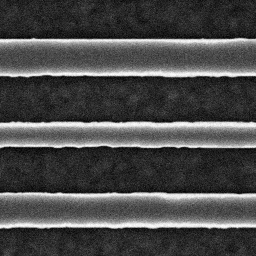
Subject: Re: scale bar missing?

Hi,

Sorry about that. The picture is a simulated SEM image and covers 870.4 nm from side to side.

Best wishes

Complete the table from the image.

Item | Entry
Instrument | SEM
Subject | lines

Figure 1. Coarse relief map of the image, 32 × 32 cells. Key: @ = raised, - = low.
--------------------------------
--------------------------------
--------------------------------
--------------------------------
--------------------------------
@@@@@@@@@@@@@@@@@@@@@@@@@@@@@@@@
@@@@@@@@@@@@@@@@@@@@@@@@@@@@@@@@
@@@@@@@@@@@@@@@@@@@@@@@@@@@@@@@@
@@@@@@@@@@@@@@@@@@@@@@@@@@@@@@@@
-@------------------------------
--------------------------------
--------------------------------
--------------------------------
--------------------------------
--------------------------------
@@@@@@@@@@@@@@@@@@@@@@@@@@@@@@@@
@@@@@@@@@@@@@@@@@@@@@@@@@@@@@@@@
@@@@@@@@@@@@@@@@@@@@@@@@@@@@@@@@
--------------------------------
--------------------------------
--------------------------------
--------------------------------
--------------------------------
--------------------------------
@@@@@@@@@@@@@@@@@@@@@@@@@@@@@@@@
@@@@@@@@@@@@@@@@@@@@@@@@@@@@@@@@
@@@@@@@@@@@@@@@@@@@@@@@@@@@@@@@@
@@@@@@@@@@@@@@@@@@@@@@@@@@@@@@@@
--------------------------------
--------------------------------
--------------------------------
--------------------------------